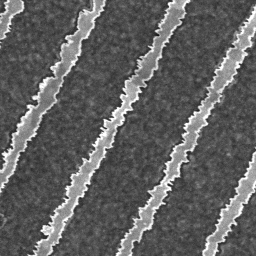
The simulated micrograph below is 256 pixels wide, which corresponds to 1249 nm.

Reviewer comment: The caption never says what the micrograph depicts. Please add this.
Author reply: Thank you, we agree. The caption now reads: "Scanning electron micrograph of one or a few lines or trenches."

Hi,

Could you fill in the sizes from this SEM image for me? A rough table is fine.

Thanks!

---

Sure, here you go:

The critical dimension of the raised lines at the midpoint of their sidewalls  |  61.6 nanometers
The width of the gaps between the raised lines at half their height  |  282 nanometres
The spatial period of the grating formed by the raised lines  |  355 nanometres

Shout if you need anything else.